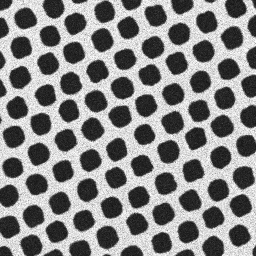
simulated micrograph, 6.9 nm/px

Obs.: a regular array of holes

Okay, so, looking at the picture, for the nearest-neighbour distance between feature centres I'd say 0.196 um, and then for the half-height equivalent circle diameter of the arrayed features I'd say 149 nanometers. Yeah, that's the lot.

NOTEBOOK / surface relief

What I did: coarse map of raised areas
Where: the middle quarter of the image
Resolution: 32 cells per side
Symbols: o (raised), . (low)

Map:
oooooo....ooo....ooo...ooo.....o
oooooo.....oooooooo.....oo.....o
...ooo.....oooooooo.....ooo..ooo
....oo.....ooo..ooo.....oooooooo
....ooo..ooo.....oo.....ooooooo.
.....ooooooo.....ooooooooo...ooo
....oooooooo......ooooooo.....oo
..oooo....oo.....oooooooo.....oo
ooooo.....ooo...oo....ooo.....oo
...oo......ooooooo.....oo....ooo
...ooo.....ooo..oo.....oooooooo.
....ooo...oo....oo.....oooooooo.
....ooooooo......oo...oooo...oo.
....ooo.ooo......oooooooo.....oo
..ooo....ooo.....ooooooo......oo
oooo.....oooo..oooo...ooo.....oo
..oo......oooooooo....ooo....ooo
...oo.....ooooooo......ooooooo..
...oo....oooo.oooo.....ooooooo..
...ooooooooo...ooo....ooo...ooo.
...oooooooo.....ooooooo......oo.
..oooo..ooo.....ooooooo......ooo
oooo.....oo.....oooooooo.....ooo
oooo.....oo....ooo...ooo.....ooo
.ooo......ooooooo.....ooo..oooo.
..oo.....oooooooo.....oooooooo..
..ooo..oooo....oo.....oooooooo..
..oooooooo.....ooo...ooo...ooo..
..oooooooo......ooooooo.....oo..
oooo....ooo.....ooooooo.....ooo.
ooo.....ooo....oooooooo.....oooo
ooo.....ooooooooo....oo.....ooo.